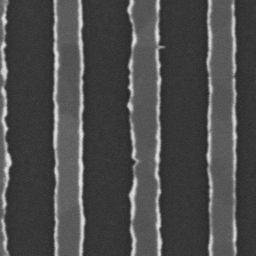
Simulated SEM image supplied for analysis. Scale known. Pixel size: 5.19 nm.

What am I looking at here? one or a few lines or trenches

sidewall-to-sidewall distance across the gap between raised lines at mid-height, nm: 265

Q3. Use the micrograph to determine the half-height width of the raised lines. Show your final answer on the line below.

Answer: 133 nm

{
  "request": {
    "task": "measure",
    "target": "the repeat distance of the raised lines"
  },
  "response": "399 nm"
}